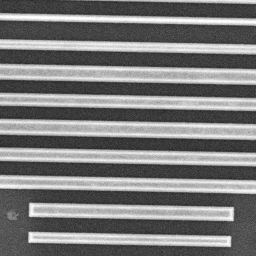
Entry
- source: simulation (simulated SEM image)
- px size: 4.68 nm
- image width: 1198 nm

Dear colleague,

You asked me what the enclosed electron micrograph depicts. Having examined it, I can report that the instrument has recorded groups of lines, slits or small figures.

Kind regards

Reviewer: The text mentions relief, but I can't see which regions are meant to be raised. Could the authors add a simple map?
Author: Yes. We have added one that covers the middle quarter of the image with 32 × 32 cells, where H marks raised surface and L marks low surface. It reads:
LLLLLLLLLLLLLLLLLLLLLLLLLLLLLLLL
HHHHHHHHHHHHHHHHHHHHHHHHHHHHHHHH
HHHHHHHHHHHHHHHHHHHHHHHHHHHHHHHH
HHHHHHHHHHHHHHHHHHHHHHHHHHHHHHHH
LLLLLLLLLLLLLLLLLLLLLLLLLLLLLLLL
LLLLLLLLLLLLLLLLLLLLLLLLLLLLLLLL
LLLLLLLLLLLLLLLLLLLLLLLLLLLLLLLL
LLLLLLLLLLLLLLLLLLLLLLLLLLLLLLLL
HHHHHHHHHHHHHHHHHHHHHHHHHHHHHHLL
HHHHHHHHHHHHHHHHHHHHHHHHHHHHHHHH
LLLLHHHHHHHHHHHHHHHHHHHHHHHHHHHH
LLLLLLLLLLLLLLLLLLLLLLLLLLLLLLLL
LLLLLLLLLLLLLLLLLLLLLLLLLLLLLLLL
LLLLLLLLLLLLLLLLLLLLLLLLLLLLLLLL
HHHHHHHHHHHLLLLLLLLLLLLLLLLLLLLL
HHHHHHHHHHHHHHHHHHHHHHHHHHHHHHHH
HHHHHHHHHHHHHHHHHHHHHHHHHHHHHHHH
HHHHHHHHHHHHHHHHHHHHHHHHHHHHHHHH
LLLLLLLLLLLLLLLLLLLLLLLLLLLLLLLL
LLLLLLLLLLLLLLLLLLLLLLLLLLLLLLLL
LLLLLLLLLLLLLLLLLLLLLLLLLLLLLLLL
LLLLLLLLLLLLLLLLLLLLLLLLLLLLLLLL
HHHHHHHHHHHHHHHHHHHHHHHHHHHHHHHH
HHHHHHHHHHHHHHHHHHHHHHHHHHHHHHHH
LLLLLLLLLHHHHHHHHHHHHHHHHHHHHHHH
LLLLLLLLLLLLLLLLLLLLLLLLLLLLLLLL
LLLLLLLLLLLLLLLLLLLLLLLLLLLLLLLL
LLLLLLLLLLLLLLLLLLLLLLLLLLLLLLLL
HHHHLLLLLLLLLLLLLLLLLLLLLLLLLLLL
HHHHHHHHHHHHHHHHHHHHHHHHHHHHHHHH
HHHHHHHHHHHHHHHHHHHHHHHHHHHHHHHH
LLLLLLLLLLLLLLLLLLLLHHHHHHHHHHHH